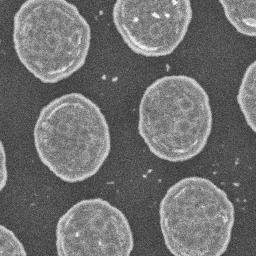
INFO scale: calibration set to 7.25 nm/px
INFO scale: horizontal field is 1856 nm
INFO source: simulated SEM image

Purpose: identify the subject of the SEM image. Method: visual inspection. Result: raised bodies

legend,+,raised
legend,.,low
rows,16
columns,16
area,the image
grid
.++++..+++++..++
.++++..+++++...+
.+++++..+++.....
.++++...........
..+++..........+
.........++++..+
...+++...++++..+
..+++++..++++..+
..+++++..++++...
..+++++...++....
...+++..........
...........++...
..........++++..
....++++..+++++.
+...++++..++++..
+...++++...+++..